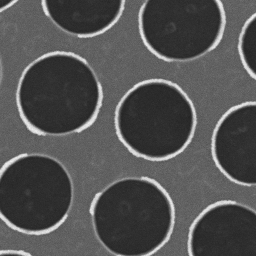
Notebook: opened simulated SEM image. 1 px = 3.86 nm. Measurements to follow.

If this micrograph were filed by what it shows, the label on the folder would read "holes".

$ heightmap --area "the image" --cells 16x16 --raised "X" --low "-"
XXX----XX-----XX
XXXX---XX-----XX
XXXXXXXXX----XX-
XXX-XXXXXX--XXX-
XX----XXXXXXXXXX
X-----XXX--XXXXX
X-----XX----XXXX
XX---XX-----XX--
XXXXXXXX----XX--
XXXXXXXXX--XXX--
X---XXXXXXXXXX--
----XXX--XXXXXXX
----XX----XXXXXX
----XX-----XX---
XXXXXX----XX----
XXXXXXX---XX----